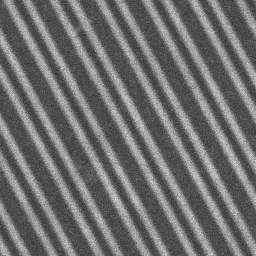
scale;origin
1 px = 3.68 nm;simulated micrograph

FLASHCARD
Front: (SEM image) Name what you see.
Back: parallel lines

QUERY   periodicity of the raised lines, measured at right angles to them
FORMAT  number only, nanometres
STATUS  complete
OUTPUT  74.8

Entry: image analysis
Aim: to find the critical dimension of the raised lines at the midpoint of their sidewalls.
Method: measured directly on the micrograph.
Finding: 23.9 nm